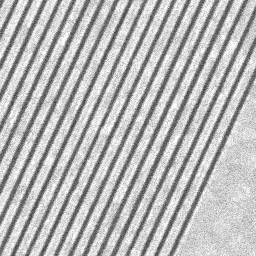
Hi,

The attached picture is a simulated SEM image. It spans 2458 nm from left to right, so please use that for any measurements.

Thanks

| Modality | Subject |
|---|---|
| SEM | parallel lines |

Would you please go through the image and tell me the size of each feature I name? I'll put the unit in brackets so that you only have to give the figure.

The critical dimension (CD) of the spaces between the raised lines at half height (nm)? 51.2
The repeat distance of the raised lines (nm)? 125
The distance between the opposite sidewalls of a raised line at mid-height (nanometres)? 77.3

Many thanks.